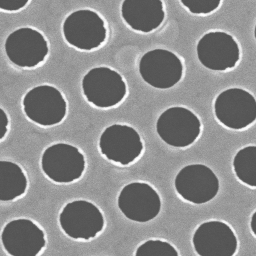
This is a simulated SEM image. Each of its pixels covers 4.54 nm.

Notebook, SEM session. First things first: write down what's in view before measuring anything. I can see a regular array of holes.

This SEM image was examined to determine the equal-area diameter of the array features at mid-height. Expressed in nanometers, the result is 186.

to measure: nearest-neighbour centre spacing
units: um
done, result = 0.271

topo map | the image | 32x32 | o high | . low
...oooooooooooo.....ooo....ooooo
ooooooooo...ooo.....oooo..oooooo
oooooooo.....ooo....oooooooooooo
ooo.oooo.....oooo...oooooooooooo
o....ooo.....oooooooooooo....ooo
o.....ooo....oooooooooooo.....oo
o.....ooooooooooooo..oooo.....oo
o....ooooooooooooo....ooo.....oo
oooooooooooo.oooo......ooo...ooo
ooooooooooo....ooo.....ooooooooo
oooooooooo......ooo...oooooooooo
oooo...oooo.....oooooooooooo...o
ooo.....ooo....oooooooooooo.....
ooo.....ooooooooooooo..oooo.....
.oo.....oooooooooooo....ooo.....
.oooo..ooooooooooooo.....ooo...o
.oooooooooooo....ooo.....ooooooo
oooooooooooo......oo....oooooooo
oooooo...oooo.....ooooooooooooo.
ooooo.....ooo....oooooooooooo...
..ooo......oooo.ooooooooooooo...
...ooo....oooooooooooo.....oo...
...oooo..ooooooooooooo.....ooo..
...oooooooooooo....ooo.....ooooo
..ooooooooooooo.....ooo....ooooo
ooooooooo..oooo.....oooooooooooo
oooooooo....ooo.....oooooooooooo
oo.oooo......oooo..oooooooooooo.
o....ooo.....oooooooooooo....oo.
.....oooo...oooooooooooo.....ooo
......oooooooooooo...ooo......oo
o....oooooooooooo.....ooo....ooo